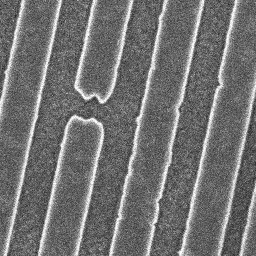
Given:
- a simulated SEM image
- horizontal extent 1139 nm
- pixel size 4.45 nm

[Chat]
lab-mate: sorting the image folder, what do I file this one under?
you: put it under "one or a few lines or trenches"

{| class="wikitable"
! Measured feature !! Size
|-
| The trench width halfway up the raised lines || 143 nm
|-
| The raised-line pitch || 310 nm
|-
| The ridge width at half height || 167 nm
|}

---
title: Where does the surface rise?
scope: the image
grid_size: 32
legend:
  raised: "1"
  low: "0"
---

00011111000011110000011110000111
00011110000111110000111110000111
00111110000111110000111110000111
00111110000111110000111110000111
00111110000111100000111100001111
00111100000111100001111100001111
01111100001111100001111100001111
01111100001111100001111100001111
01111100001111100001111100001111
01111100001111000001111000011111
01111000001111000011111000001111
11111000001111000011111000011111
11111000000010000011111000011111
11111000000000000011110000011110
11111000000000000111110000111110
11110000011100000111110000111110
11110000111110000111110000111110
11110000111110000111110000111110
11110000111110000111100000111100
11100000111100000111100001111100
11100001111100001111100001111100
11100001111100001111100001111100
11100001111100001111100001111000
11100001111000001111000011111000
11000011111000011111000011111000
11000011111000011111000011111001
11000011111000011111000011111001
11000011111000011110000011110001
10000011110000111110000111110001
10000111110000111110000111110011
10000111110000111110000111110011
10000111110000111110000111110011